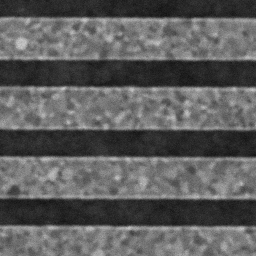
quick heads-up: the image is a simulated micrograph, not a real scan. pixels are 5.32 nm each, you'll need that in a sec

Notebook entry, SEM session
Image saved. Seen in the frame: one or a few lines or trenches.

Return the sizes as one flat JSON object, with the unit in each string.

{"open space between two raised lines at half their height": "30.2 px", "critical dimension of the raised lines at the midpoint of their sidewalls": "210 nanometres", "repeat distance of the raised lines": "370 nm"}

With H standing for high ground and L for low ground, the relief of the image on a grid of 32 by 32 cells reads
LLLLLLLLLLLLLLLLLLLLLLLLLLLLLLLL
LLLLLLLLLLLLLLLLLLLLLLLLLLLLLLLL
HHHHHHHHHHHHHHHHHHHHHHLLHHHHLHHL
HHHHHHHHHHHHHHHHHHHHHHHHHHHHHHHH
HHHHHHHHHHHHHHHHHHHHHHHHHHHHHHHH
HHHHHHHHHHHHHHHHHHHHHHHHHHHHHHHH
HHHHHHHHHHHHHHHHHHHHHHHHHHHHHHHH
LLLLLLLLLLLLLLLLLLLLLLLLLLLLLLLL
LLLLLLLLLLLLLLLLLLLLLLLLLLLLLLLL
LLLLLLLLLLLLLLLLLLLLLLLLLLLLLLLL
LLLLLLLLLLLLLLLLLLLLLLLLLLLLLLLL
HHHHHHHHHHHHHHHHHHHHHHHHHHHHHHHH
HHHHHHHHHHHHHHHHHHHHHHHHHHHHHHHH
HHHHHHHHHHHHHHHHHHHHHHHHHHHHHHHH
HHHHHHHHHHHHHHHHHHHHHHHHHHHHHHHH
HHHHHHHHHHHHHHHHHHHHHHHHHHHHHHHH
LLLLLLLLLLLLLLLLLLLLLLLLLLLLLLLL
LLLLLLLLLLLLLLLLLLLLLLLLLLLLLLLL
LLLLLLLLLLLLLLLLLLLLLLLLLLLLLLLL
LLLLLLLLLLLLLLLLLLLLLLLLLLLLLLLL
HHHHHHHHHHHHHHHHHHHHHHHHHHHHHHHH
HHHHHHHHHHHHHHHHHHHHHHHHHHHHHHHH
HHHHHHHHHHHHHHHHHHHHHHHHHHHHHHHH
HHHHHHHHHHHHHHHHHHHHHHHHHHHHHHHH
HHHHHHHHHHHHHHHHHHHHHHHHHHHHHHHH
LLLLLLLLLLLLLLLLLLLLLLLLLLLLLLLL
LLLLLLLLLLLLLLLLLLLLLLLLLLLLLLLL
LLLLLLLLLLLLLLLLLLLLLLLLLLLLLLLL
HHHHHHHHHHHHHHHHHLLLLLLLLLLLLLLH
HHHHHHHHHHHHHHHHHHHHHHHHHHHHHHHH
HHHHHHHHHHHHHHHHHHHHHHHHHHHHHHHH
HHHHHHHHHHHHHHHHHHHHHHHHHHHHHHHH